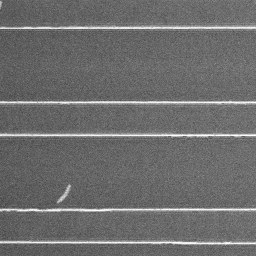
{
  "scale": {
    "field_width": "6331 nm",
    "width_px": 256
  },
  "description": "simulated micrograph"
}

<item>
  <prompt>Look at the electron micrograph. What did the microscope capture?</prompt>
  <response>lines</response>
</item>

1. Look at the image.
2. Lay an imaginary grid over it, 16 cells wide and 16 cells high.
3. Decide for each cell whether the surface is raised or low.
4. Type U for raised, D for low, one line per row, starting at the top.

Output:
UUUUUUUUUUUUUUUU
UUUUUUUUUUUUUUUU
DDDDDDDDDDDDDDDD
DDDDDDDDDDDDDDDD
DDDDDDDDDDDDDDDD
DDDDDDDDDDDDDDDD
UUUUUUUUUUUUUUUU
UUUUUUUUUUUUUUUU
DDDDDDDDDDDDDDDD
DDDDDDDDDDDDDDDD
DDDDDDDDDDDDDDDD
DDDDDDDDDDDDDDDD
DDDDDDDDDDDDDDDD
UUUUUUUUUUUUUUUU
UUUUUUUUUUUUUUUU
DDDDDDDDDDDDDDDD